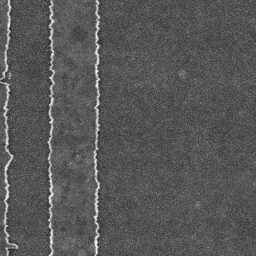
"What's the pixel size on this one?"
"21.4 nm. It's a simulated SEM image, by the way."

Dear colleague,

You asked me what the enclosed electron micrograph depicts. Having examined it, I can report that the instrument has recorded one or a few lines or trenches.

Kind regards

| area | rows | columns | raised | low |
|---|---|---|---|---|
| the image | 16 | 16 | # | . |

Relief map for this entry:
#..###..........
#..###..........
#..###..........
...###..........
...###..........
...###..........
...###..........
...###..........
...###..........
#..###..........
...###..........
...###..........
...###..........
...###..........
...###..........
#..###..........